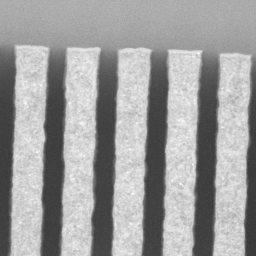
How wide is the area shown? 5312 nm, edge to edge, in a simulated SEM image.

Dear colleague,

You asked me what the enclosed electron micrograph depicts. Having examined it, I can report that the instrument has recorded parallel lines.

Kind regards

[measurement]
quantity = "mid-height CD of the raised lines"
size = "640 nm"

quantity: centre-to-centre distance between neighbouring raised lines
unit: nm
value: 1050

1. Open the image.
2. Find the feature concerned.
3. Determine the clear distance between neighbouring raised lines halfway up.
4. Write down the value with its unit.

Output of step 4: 0.415 microns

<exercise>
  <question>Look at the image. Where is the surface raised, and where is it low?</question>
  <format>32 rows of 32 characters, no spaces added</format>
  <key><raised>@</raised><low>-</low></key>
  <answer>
--------------------------------
--------------------------------
--------------------------------
--------------------------------
--------------------------------
--------------------------------
--@@@@---@@@---@@@@--@@-@-------
--@@@@--@@@@---@@@@--@@@@---@@@-
--@@@@--@@@@---@@@@--@@@@---@@@-
--@@@@--@@@@---@@@@--@@@@--@@@@-
--@@@@--@@@@---@@@@--@@@@--@@@@-
--@@@@--@@@@---@@@@--@@@@--@@@@-
--@@@@--@@@@---@@@@--@@@@--@@@@-
--@@@@--@@@@---@@@---@@@@--@@@@-
--@@@@--@@@@---@@@---@@@@--@@@@-
--@@@---@@@@--@@@@---@@@@--@@@@-
--@@@@--@@@@--@@@@---@@@@--@@@@-
--@@@@--@@@@--@@@@---@@@@--@@@@-
--@@@---@@@@--@@@@---@@@@--@@@@-
--@@@---@@@@--@@@@---@@@@--@@@@-
--@@@---@@@@--@@@@---@@@@--@@@@-
--@@@---@@@@--@@@@---@@@---@@@@-
--@@@---@@@@--@@@@---@@@@--@@@@-
-@@@@---@@@@--@@@@---@@@---@@@@-
-@@@@---@@@@--@@@@---@@@---@@@@-
-@@@@---@@@@--@@@@--@@@@---@@@@-
-@@@@---@@@@--@@@@---@@@---@@@@-
-@@@@---@@@---@@@@---@@@---@@@@-
-@@@@---@@@@--@@@@--@@@@---@@@@-
-@@@@---@@@@--@@@@--@@@@---@@@@-
-@@@@---@@@---@@@@--@@@@---@@@@-
-@@@@---@@@---@@@@--@@@@---@@@@-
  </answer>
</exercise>